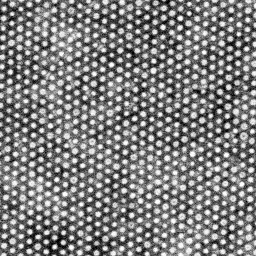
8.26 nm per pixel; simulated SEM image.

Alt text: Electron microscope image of a regular array of raised bodies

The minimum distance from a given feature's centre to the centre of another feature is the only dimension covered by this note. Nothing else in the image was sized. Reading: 78.1 nm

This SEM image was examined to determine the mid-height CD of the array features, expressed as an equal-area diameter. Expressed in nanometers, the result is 38.4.